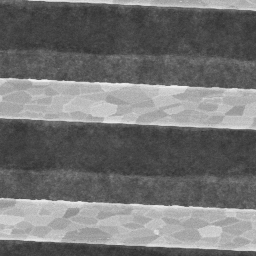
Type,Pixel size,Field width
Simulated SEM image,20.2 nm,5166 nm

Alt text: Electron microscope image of lines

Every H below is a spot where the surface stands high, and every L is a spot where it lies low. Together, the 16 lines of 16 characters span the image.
LLLLLLLLLLLLLHHH
LLLLLLLLLLLLLLLL
LLLLLLLLLLLLLLLL
HHHHHLLLLLLLLLLL
HHHHHHHHHHHHHHHH
HHHHHHHHHHHHHHHH
HHHHHHHHHHHHHHHH
LLHHHHHHHHHHHHHH
LLLLLLLLLLLLLLLL
LLLLLLLLLLLLLLLL
LLLLLLLLLLLLLLLL
HHHHHHHHHHHHHHHH
HHHHHHHHHHHHHHHH
HHHHHHHHHHHHHHHH
HHHHHHHHHHHHHHHH
LLLLLLLLLLLLHHHH